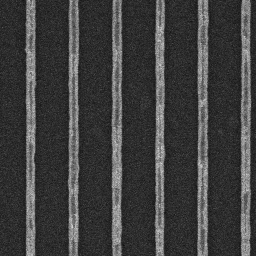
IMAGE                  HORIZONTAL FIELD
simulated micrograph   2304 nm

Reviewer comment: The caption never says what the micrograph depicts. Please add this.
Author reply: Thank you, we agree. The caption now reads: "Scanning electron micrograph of parallel lines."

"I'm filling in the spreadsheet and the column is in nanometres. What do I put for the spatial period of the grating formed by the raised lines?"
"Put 387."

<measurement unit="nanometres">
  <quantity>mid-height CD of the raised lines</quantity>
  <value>60.8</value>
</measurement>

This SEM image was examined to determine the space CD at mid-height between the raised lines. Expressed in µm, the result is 0.331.